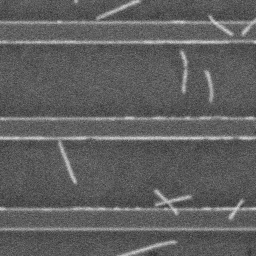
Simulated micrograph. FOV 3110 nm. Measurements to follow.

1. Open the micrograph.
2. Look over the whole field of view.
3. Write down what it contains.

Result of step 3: lines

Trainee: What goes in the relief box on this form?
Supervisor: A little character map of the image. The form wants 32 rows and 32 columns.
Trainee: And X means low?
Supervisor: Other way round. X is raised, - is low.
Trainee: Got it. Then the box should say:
--------------------------------
--------------------------------
--------------------------------
XXXXXXXXXXXXXXXXXXXXXXXXXXXXXXXX
XXXXXXXXXXXXXXXXXXXXXXXXXXXXXXXX
--------------------------------
--------------------------------
--------------------------------
--------------------------------
--------------------------------
--------------------------------
--------------------------------
--------------------------------
--------------------------------
--------------------------------
XXXXXXXXXXXXXXXXXXXXXXXXXXXXXXXX
XXXXXXXXXXXXXXXXXXXXXXXXXXXXXXXX
--------------------------------
--------------------------------
--------------------------------
--------------------------------
--------------------------------
--------------------------------
--------------------------------
--------------------------------
--------------------------------
XXXXXXXXXXXXXXXXXXXXXXXXXXXXXXXX
XXXXXXXXXXXXXXXXXXXXXXXXXXXXXXXX
XXXXXXXXXXXXXXXXXXXXXXXXXXXXXXXX
--------------------------------
--------------------------------
--------------------------------